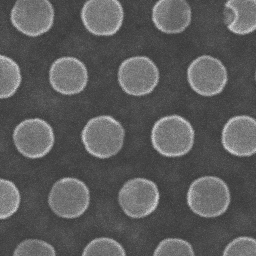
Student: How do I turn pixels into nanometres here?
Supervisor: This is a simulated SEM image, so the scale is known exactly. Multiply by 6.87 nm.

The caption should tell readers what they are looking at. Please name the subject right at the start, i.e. a regular array of raised bodies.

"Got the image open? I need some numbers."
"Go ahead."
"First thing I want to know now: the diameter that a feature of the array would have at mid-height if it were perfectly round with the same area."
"39.4 pixels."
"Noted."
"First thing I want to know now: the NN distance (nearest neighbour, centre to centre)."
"477 nm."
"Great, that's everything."